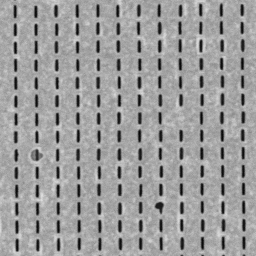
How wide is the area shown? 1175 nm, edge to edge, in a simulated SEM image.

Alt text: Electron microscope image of a regular array of holes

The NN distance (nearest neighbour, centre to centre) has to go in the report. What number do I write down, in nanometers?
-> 80.8